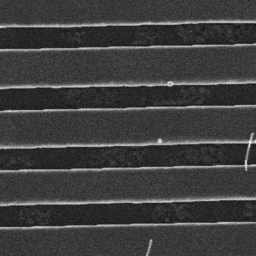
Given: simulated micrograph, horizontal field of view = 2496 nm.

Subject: lines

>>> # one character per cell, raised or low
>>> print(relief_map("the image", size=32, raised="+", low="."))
++++++++++++++++++++++++++++++++
++++++++++++++++++++++++++++++++
++++++++++++++++++++++++++++++++
................................
................................
...............................+
++++++++++++++++++++++++++++++++
++++++++++++++++++++++++++++++++
++++++++++++++++++++++++++++++++
++++++++++++++++++++++++++++++++
+++++++++++++++++++++++.........
................................
................................
..................++++++++++++++
++++++++++++++++++++++++++++++++
++++++++++++++++++++++++++++++++
++++++++++++++++++++++++++++++++
++++++++++++++++++++++++++++++++
................................
................................
................................
++++++++++++++++++++++++++++++++
++++++++++++++++++++++++++++++++
++++++++++++++++++++++++++++++++
++++++++++++++++++++++++++++++++
++++............................
................................
................................
++++++++++++++++++++++++++++++++
++++++++++++++++++++++++++++++++
++++++++++++++++++++++++++++++++
++++++++++++++++++++++++++++++++